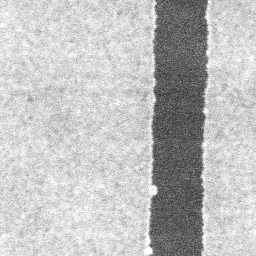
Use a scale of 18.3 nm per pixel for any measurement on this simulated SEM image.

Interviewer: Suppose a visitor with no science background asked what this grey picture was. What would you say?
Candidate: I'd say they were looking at one or a few lines or trenches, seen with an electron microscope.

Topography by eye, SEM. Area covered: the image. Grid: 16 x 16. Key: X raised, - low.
XXXXXXXXXX---XXX
XXXXXXXXXX---XXX
XXXXXXXXXX---XXX
XXXXXXXXXX---XXX
XXXXXXXXXX---XXX
XXXXXXXXXX---XXX
XXXXXXXXXX---XXX
XXXXXXXXX----XXX
XXXXXXXXX----XXX
XXXXXXXXX----XXX
XXXXXXXXX----XXX
XXXXXXXXXX---XXX
XXXXXXXXX----XXX
XXXXXXXXX----XXX
XXXXXXXXX----XXX
XXXXXXXXX----XXX